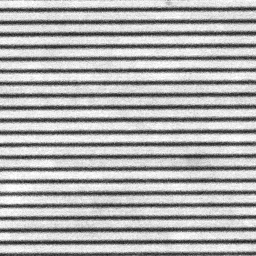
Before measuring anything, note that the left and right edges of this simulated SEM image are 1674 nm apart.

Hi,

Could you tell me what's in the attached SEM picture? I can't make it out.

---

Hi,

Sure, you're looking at parallel lines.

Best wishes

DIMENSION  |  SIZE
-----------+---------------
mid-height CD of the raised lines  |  0.0474 µm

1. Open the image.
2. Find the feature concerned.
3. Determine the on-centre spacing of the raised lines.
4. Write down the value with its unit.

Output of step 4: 80.1 nm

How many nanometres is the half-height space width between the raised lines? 29.4